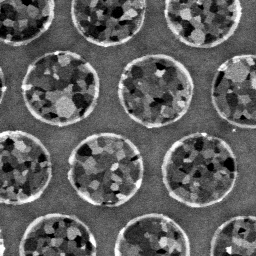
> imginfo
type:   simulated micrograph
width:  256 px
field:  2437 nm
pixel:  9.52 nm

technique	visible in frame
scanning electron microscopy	raised bodies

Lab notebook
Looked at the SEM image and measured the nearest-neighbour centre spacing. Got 881 nm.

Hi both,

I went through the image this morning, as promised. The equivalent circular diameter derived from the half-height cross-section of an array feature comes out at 682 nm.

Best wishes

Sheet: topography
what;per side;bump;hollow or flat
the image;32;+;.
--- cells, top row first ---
++++++...+++++++++...+++++++++..
++++++...+++++++++...+++++++++..
++++++...+++++++++...+++++++++..
++++++....+++++++....++++++++...
+++++.....++++++......++++++....
.............+..........+++.....
................................
.....+++++.......+++++.......+++
....+++++++.....+++++++.....++++
...+++++++++...+++++++++...+++++
...+++++++++...+++++++++...+++++
...+++++++++...+++++++++...+++++
...+++++++++...+++++++++...+++++
....+++++++.....+++++++....+++++
.....+++++.......+++++......++++
.......+..........+++........+++
.+..............................
++++.......+++++.......+++++....
++++++....+++++++.....++++++....
++++++...++++++++....++++++++...
++++++...+++++++++...++++++++...
++++++...+++++++++..+++++++++...
++++++...+++++++++...++++++++...
+++++....++++++++....++++++++...
+++++.....++++++......++++++....
............+++.........++......
................................
.....+++++.......++++........+++
....+++++++.....++++++......++++
...++++++++....++++++++....+++++
...+++++++++...++++++++....+++++
...+++++++++...++++++++...++++++